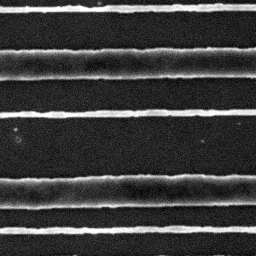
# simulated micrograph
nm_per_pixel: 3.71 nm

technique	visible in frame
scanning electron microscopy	lines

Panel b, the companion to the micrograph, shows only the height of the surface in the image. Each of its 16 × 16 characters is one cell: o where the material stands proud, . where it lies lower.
................
................
................
oooooooooooooooo
oooooooooooooooo
................
................
................
................
................
................
oooooooooooooooo
oooooooooooooooo
................
................
................